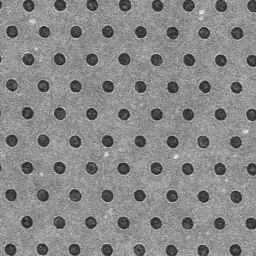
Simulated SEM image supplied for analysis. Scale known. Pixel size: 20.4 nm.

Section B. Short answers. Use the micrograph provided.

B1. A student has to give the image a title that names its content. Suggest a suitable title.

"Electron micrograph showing a regular array of holes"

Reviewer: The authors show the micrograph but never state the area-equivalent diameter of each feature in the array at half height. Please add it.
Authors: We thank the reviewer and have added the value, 256 nm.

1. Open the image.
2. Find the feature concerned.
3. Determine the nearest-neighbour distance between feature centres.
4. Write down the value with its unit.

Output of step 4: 0.636 µm